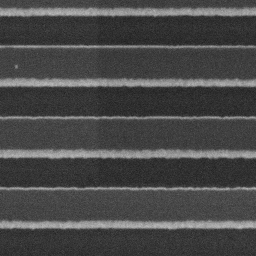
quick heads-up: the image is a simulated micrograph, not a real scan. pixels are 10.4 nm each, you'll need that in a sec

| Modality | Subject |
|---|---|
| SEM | lines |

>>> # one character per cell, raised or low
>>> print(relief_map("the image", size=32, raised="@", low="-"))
@@@@@@@@@@@@@@@@@@@@@@@@@@@@@@@@
@@@@@@@@@@@@@@@@@@@@@@@@@@@@@@@@
--------------------------------
--------------------------------
--------------------------------
--------------------------------
@@@@@@@@@@@@@@@@@@@@@@@@@@@@@@@@
@@@@@@@@@@@@@@@@@@@@@@@@@@@@@@@@
@@@@@@@@@@@@@@@@@@@@@@@@@@@@@@@@
@@@@@@@@@@@@@@@@@@@@@@@@@@@@@@@@
@@@@@@@@@@@@@@@@@@@@@@@@@@@@@@@@
--------------------------------
--------------------------------
--------------------------------
--------------------------------
@@@@@@@@@@@@@@@@@@@@@@@@@@@@@@@@
@@@@@@@@@@@@@@@@@@@@@@@@@@@@@@@@
@@@@@@@@@@@@@@@@@@@@@@@@@@@@@@@@
@@@@@@@@@@@@@@@@@@@@@@@@@@@@@@@@
@-----@@-----@@@@@@-----@-@@@@@@
--------------------------------
--------------------------------
--------------------------------
--------------------------------
@@@@@@@@@@@@@@@@@@@@@@@@@@@@@@@@
@@@@@@@@@@@@@@@@@@@@@@@@@@@@@@@@
@@@@@@@@@@@@@@@@@@@@@@@@@@@@@@@@
@@@@@@@@@@@@@@@@@@@@@@@@@@@@@@@@
--------------------------------
--------------------------------
--------------------------------
--------------------------------